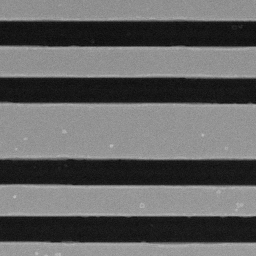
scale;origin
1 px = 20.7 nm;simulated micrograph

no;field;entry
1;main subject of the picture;lines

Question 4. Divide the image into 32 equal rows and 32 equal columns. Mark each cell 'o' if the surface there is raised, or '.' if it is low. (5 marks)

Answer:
oooooooooooooooooooooooooooooooo
oooooooooooooooooooooooooooooooo
..........oo................oooo
................................
................................
................................
oooooooooooooooooooooooooooooooo
oooooooooooooooooooooooooooooooo
oooooooooooooooooooooooooooooooo
oooooooooooooooooooooooooooooooo
................................
................................
................................
oooooooooooooooooooooooooooooooo
oooooooooooooooooooooooooooooooo
oooooooooooooooooooooooooooooooo
oooooooooooooooooooooooooooooooo
oooooooooooooooooooooooooooooooo
oooooooooooooooooooooooooooooooo
oooooooooooooooooooooooooooooooo
................................
................................
................................
oooooooooooooooooooooooooooooooo
oooooooooooooooooooooooooooooooo
oooooooooooooooooooooooooooooooo
oooooooooooooooooooooooooooooooo
................................
................................
................................
oooooooooooooooooooooooooooooooo
oooooooooooooooooooooooooooooooo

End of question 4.